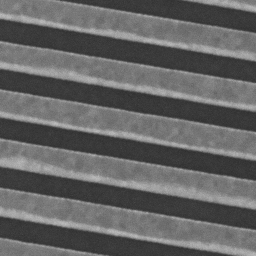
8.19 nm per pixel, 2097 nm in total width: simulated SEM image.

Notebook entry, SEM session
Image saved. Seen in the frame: lines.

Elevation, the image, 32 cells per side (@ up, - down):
@@@@@@@@@@-----------------@@@@@
@@@@@@@@@@@@@@@@----------------
--@@@@@@@@@@@@@@@@@@@@----------
--------@@@@@@@@@@@@@@@@@@@@----
--------------@@@@@@@@@@@@@@@@@@
@@------------------@@@@@@@@@@@@
@@@@@@@@------------------@@@@@@
@@@@@@@@@@@@@@------------------
-@@@@@@@@@@@@@@@@@@@------------
-------@@@@@@@@@@@@@@@@@@@------
------------@@@@@@@@@@@@@@@@@@@@
@@----------------@@@@@@@@@@@@@@
@@@@@@@@----------------@@@@@@@@
@@@@@@@@@@@@@@----------------@@
@@@@@@@@@@@@@@@@@@@@------------
------@@@@@@@@@@@@@@@@@@@@------
-----------@@@@@@@@@@@@@@@@@@@@@
@-----------------@@@@@@@@@@@@@@
@@@@@@@----------------@@@@@@@@@
@@@@@@@@@@@@@----------------@@@
@@@@@@@@@@@@@@@@@@@-------------
------@@@@@@@@@@@@@@@@@@@-------
-----------@@@@@@@@@@@@@@@@@@@@-
-----------------@@@@@@@@@@@@@@@
@@@@@@------------------@@@@@@@@
@@@@@@@@@@@@-----------------@@@
@@@@@@@@@@@@@@@@@@--------------
----@@@@@@@@@@@@@@@@@@@@--------
----------@@@@@@@@@@@@@@@@@@@@--
---------------@@@@@@@@@@@@@@@@@
@@@@-----------------@@@@@@@@@@@
@@@@@@@@@@------------------@@@@